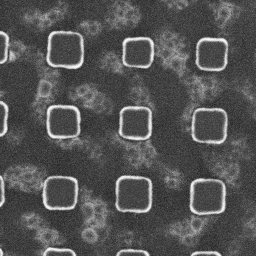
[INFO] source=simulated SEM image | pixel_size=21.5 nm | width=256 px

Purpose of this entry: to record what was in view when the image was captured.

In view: a regular array of raised bodies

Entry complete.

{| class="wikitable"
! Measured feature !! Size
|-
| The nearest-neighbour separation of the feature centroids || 1540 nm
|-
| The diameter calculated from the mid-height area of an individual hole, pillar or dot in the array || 0.758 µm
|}